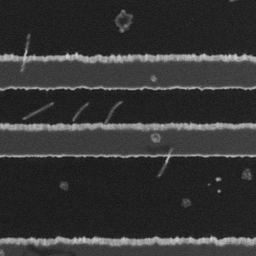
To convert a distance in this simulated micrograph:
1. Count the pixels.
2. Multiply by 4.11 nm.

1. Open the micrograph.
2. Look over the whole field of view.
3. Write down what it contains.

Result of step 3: lines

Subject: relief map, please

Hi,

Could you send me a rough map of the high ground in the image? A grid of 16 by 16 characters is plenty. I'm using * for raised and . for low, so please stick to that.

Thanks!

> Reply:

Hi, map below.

................
................
................
....*...........
****************
****************
................
................
****************
****************
................
................
................
................
................
****************